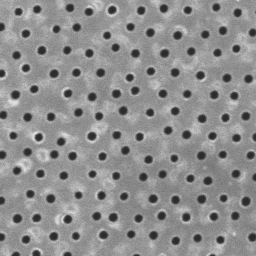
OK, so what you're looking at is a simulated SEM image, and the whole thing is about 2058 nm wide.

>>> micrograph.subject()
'a regular array of holes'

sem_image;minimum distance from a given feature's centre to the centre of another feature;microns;0.165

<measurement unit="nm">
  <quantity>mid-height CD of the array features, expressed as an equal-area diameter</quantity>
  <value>68.5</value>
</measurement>